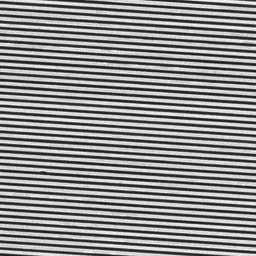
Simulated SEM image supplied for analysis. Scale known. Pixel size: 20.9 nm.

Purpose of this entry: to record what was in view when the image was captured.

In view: parallel lines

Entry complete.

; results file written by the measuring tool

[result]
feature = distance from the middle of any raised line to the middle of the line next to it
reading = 135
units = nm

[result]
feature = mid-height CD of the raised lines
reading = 72.9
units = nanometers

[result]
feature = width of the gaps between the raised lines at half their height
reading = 70.3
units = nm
